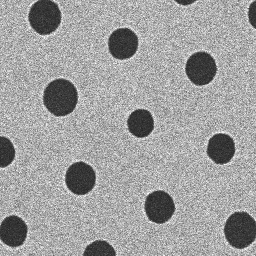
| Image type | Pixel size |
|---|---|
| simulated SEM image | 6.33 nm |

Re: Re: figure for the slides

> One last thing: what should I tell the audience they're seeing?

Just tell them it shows holes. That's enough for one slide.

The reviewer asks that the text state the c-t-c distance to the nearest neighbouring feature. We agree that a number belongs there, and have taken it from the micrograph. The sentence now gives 516 nm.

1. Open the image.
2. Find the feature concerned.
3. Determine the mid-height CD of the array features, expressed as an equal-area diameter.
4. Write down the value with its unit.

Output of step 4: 197 nm